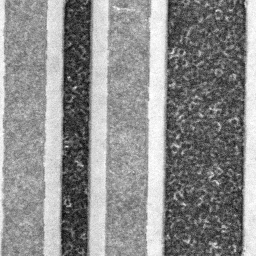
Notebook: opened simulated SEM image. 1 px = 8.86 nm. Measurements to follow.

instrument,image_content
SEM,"one or a few lines or trenches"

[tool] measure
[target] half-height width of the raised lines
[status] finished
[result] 497 nm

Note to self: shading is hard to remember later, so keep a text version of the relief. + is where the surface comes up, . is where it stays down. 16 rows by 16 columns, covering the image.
+++...++++......
+++...++++......
+++...++++......
+++...++++......
+++...++++......
+++...++++......
+++...++++......
+++...++++......
+++...++++......
+++...++++......
+++...++++......
+++...++++......
+++...++++......
+++...++++......
+++...++++......
+++...++++......